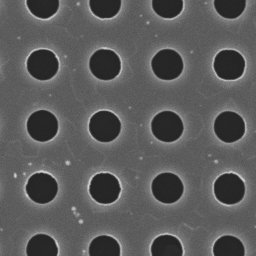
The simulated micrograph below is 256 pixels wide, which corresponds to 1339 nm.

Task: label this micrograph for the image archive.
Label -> a regular array of holes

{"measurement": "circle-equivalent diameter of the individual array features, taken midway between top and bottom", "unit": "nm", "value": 164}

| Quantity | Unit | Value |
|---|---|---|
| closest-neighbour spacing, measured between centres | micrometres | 0.324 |